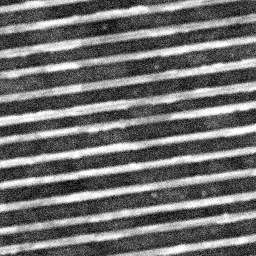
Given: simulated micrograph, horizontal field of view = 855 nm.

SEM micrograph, parallel lines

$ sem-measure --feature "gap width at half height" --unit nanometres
52.9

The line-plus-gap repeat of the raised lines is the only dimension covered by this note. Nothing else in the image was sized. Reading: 21.8 px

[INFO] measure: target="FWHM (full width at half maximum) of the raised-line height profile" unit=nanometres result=21.5